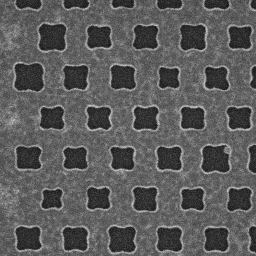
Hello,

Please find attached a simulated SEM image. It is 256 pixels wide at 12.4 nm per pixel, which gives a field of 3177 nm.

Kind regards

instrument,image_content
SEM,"a regular array of holes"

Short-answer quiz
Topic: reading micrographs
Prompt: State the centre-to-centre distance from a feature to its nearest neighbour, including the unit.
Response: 573 nanometres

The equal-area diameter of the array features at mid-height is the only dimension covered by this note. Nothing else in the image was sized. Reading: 0.331 microns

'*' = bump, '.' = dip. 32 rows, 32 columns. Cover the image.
**...***...***...***...**....**.
********************************
********************************
*****...***...***...***...***..*
*****...***...***...***...***..*
*****...***...***...**....***..*
********************************
********************************
**...***...***...***.*****..****
**...***...***...***..****..***.
**....**...***...***..****...**.
********************************
********************************
*****...***...***...***..****..*
*****...***...***...***...**...*
*****...***...***...***...**...*
********************************
********************************
**...***..****...***..***....**.
**...***...***...***...**....**.
**...***...***...***...**....**.
**************************..****
********************************
***********..****..*****.****..*
*****...***...***...***...**...*
*****...***...***...***...**...*
********************************
********************************
**...***...***...***..****..***.
**...***...***...***...***...**.
**...***...***...***...***...**.
**************...***************